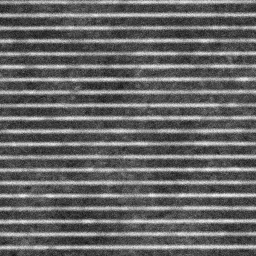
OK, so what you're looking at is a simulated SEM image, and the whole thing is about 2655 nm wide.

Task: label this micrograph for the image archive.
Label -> parallel lines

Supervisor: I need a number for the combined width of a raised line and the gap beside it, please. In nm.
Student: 134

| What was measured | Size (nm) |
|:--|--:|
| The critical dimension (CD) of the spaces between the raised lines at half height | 109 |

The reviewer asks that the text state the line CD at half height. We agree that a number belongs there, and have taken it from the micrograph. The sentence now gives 27.2 nm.